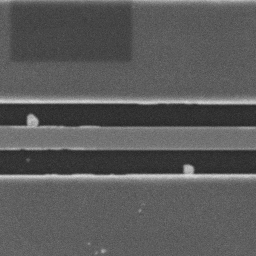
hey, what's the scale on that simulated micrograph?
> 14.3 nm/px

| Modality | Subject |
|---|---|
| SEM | lines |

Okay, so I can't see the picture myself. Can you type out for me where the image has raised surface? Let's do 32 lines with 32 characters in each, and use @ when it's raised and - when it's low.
@@@@@@@@@@@@@@@@@@@@@@@@@@@@@@@@
@@@@@@@@@@@@@@@@@@@@@@@@@@@@@@@@
@@@@@@@@@@@@@@@@@@@@@@@@@@@@@@@@
@@@@@@@@@@@@@@@@@@@@@@@@@@@@@@@@
@@@@@@@@@@@@@@@@@@@@@@@@@@@@@@@@
@@@@@@@@@@@@@@@@@@@@@@@@@@@@@@@@
@@@@@@@@@@@@@@@@@@@@@@@@@@@@@@@@
@@@@@@@@@@@@@@@@@@@@@@@@@@@@@@@@
@@@@@@@@@@@@@@@@@@@@@@@@@@@@@@@@
@@@@@@@@@@@@@@@@@@@@@@@@@@@@@@@@
@@@@@@@@@@@@@@@@@@@@@@@@@@@@@@@@
@@@@@@@@@@@@@@@@@@@@@@@@@@@@@@@@
@@@@@@@@@@@@@@@@@@@@@@@@@@@@@@@@
--------------------------------
--------------------------------
--------------------------------
@@@@@@@@@@@@@@@@@@@@@@@@@@@@@@@@
@@@@@@@@@@@@@@@@@@@@@@@@@@@@@@@@
@@@@@@@@@@@@@@@@@@@@@@@@@@@@@@@@
--------------------------------
--------------------------------
--------------------------------
@@@@@@@@@@@@@@@@@@@@@@@@@@@@@@@@
@@@@@@@@@@@@@@@@@@@@@@@@@@@@@@@@
@@@@@@@@@@@@@@@@@@@@@@@@@@@@@@@@
@@@@@@@@@@@@@@@@@@@@@@@@@@@@@@@@
@@@@@@@@@@@@@@@@@@@@@@@@@@@@@@@@
@@@@@@@@@@@@@@@@@@@@@@@@@@@@@@@@
@@@@@@@@@@@@@@@@@@@@@@@@@@@@@@@@
@@@@@@@@@@@@@@@@@@@@@@@@@@@@@@@@
@@@@@@@@@@@@@@@@@@@@@@@@@@@@@@@@
@@@@@@@@@@@@@@@@@@@@@@@@@@@@@@@@